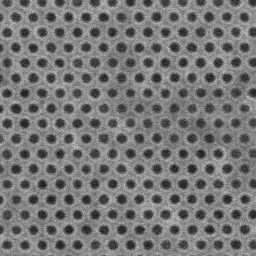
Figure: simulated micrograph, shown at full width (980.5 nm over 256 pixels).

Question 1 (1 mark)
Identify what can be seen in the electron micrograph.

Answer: a regular array of holes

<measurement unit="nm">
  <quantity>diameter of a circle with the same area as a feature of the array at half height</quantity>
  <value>44.1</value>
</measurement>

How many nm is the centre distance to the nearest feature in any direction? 65.5